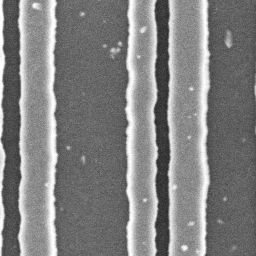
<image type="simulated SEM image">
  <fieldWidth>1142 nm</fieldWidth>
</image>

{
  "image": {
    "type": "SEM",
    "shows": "lines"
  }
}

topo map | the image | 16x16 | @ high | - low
@@@-----@@@@@---
@@@-----@@@@@---
@@@-----@@@@@---
@@@-----@@@@@---
@@@-----@@@@@---
@@@-----@@@@@---
@@@-----@@@@@---
@@@-----@@@@@---
@@@-----@@@@@---
@@@-----@@@@@---
@@@-----@@@@@---
@@@-----@@@@@---
@@@-----@@@@@---
@@@-----@@@@@---
@@@-----@@@@@---
@@@-----@@@@@---